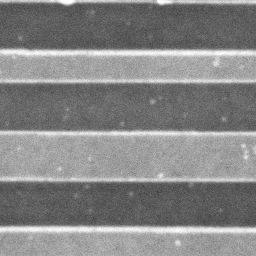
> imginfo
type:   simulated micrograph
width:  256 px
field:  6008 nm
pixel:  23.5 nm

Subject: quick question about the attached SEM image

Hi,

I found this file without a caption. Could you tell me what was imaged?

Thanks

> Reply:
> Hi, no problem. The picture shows lines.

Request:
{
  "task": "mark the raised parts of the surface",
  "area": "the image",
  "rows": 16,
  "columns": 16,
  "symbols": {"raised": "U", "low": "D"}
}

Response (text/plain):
DDDDDDDDDDDDDDDD
DDDDDDDDDDDDDDDD
DDDDDDDDDDDDDDDD
UUUUUUUUUUUUUUUU
UUUUUUUUUUUUUUUU
DDDDDDDDDDDDDDDD
DDDDDDDDDDDDDDDD
DDDDDDDDDDDDDDDD
UUUUUUUUUUUUUUUU
UUUUUUUUUUUUUUUU
UUUUUUUUUUUUUUUU
DDDDDDDDDDDDDDDD
DDDDDDDDDDDDDDDD
DDDDDDDDDDDDDDDD
UUUUUUUUUUUUUUUU
UUUUUUUUUUUUUUUU